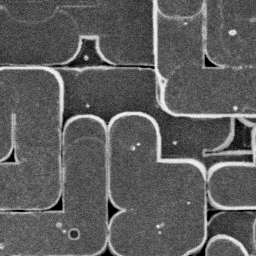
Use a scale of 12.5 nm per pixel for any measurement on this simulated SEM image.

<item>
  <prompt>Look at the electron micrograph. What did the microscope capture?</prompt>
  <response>wiring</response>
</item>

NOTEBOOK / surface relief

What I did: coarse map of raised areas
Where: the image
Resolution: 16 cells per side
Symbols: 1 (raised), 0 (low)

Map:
0000000000111111
0000000000111111
0000000000111111
0000000000111111
1110000000111111
1111000000111111
1111000000111111
1111110110000000
1111111111000000
1111111111000000
1111111111111111
1111111111111111
1111111111111111
1111111111111000
1111111111111000
1111111111111110